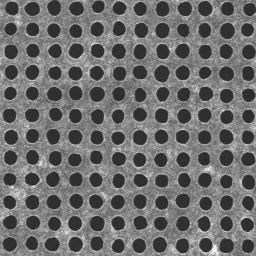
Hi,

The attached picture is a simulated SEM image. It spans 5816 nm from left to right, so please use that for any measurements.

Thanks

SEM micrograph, a regular array of holes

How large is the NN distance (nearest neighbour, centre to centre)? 471 nm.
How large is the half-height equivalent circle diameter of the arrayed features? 318 nm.